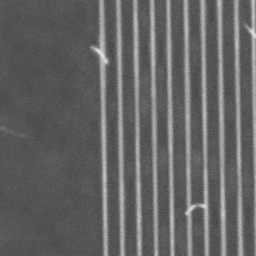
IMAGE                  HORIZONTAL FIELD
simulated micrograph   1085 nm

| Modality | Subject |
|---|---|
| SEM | parallel lines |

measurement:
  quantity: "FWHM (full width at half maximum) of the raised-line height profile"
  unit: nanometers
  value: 12.2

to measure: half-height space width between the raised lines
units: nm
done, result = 56.7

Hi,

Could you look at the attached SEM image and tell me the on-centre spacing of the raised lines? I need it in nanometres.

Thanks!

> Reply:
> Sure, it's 71.4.